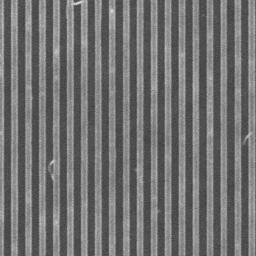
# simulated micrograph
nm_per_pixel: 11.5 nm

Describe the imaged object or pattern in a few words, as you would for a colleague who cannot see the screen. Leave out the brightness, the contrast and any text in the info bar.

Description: parallel lines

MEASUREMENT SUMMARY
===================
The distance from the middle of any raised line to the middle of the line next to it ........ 160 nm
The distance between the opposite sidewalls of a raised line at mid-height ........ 67.6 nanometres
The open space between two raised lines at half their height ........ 8.38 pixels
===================